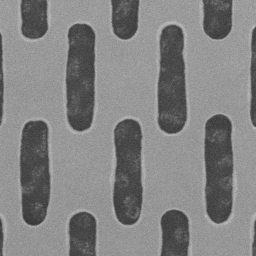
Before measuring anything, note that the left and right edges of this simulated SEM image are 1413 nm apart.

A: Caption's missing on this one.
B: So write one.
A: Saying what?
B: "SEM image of holes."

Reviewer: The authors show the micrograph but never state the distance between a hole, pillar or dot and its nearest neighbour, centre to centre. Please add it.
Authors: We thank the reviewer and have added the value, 0.504 um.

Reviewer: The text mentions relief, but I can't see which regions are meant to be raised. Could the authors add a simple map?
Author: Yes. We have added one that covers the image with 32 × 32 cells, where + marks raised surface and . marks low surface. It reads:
++....++++++++...++++++++....+++
+++...++++++++...++++++++....+++
+++...++++++++...++++++++....+++
+++...+++..+++...+++...++....+++
+++..+++....+++..+++...+++..+++.
++++++++....++++++++...++++++++.
++++++++....++++++++...++++++++.
++++++++....++++++++...++++++++.
++++++++....++++++++...++++++++.
++++++++....++++++++...++++++++.
++++++++....++++++++...++++++++.
.+++++++....++++++++...++++++++.
.+++++++....++++++++...++++++++.
.+++++++....++++++++....+++++++.
.+++++++....++++++++....+++.+++.
+++...++...++++..+++...+++...+++
+++...+++.++++....++..++++...+++
+++...++++++++....++++++++...+++
++....++++++++....+++++++....+++
++....++++++++....+++++++....+++
++....++++++++....++++++++...+++
++....++++++++....++++++++...+++
++....++++++++....++++++++...+++
+++...++++++++....+++++++....+++
+++...++++++++....+++++++....+++
+++...++++++++....++++++++...+++
+++...++++.+++....+++..+++...+++
+++..++++...+++..+++....+++.++++
.+++++++....++++++++....+++++++.
.+++++++....++++++++....+++++++.
++++++++....++++++++....+++++++.
+++++++++...++++++++....+++++++.